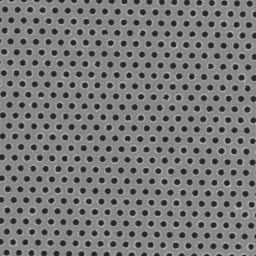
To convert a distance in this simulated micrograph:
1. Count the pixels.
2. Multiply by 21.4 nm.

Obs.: a regular array of holes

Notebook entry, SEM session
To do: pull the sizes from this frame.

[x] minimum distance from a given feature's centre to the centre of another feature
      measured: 257 nm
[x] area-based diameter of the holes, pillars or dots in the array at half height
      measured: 128 nanometres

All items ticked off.